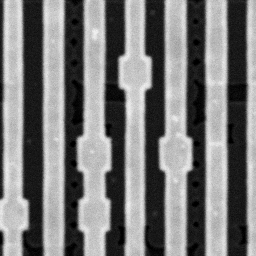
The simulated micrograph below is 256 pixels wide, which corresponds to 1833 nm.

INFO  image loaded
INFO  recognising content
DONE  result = wiring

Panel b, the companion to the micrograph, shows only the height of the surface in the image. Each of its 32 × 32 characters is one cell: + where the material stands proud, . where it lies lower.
.++...++...++...++...++...++...+
.++...++...++...++...++...++...+
.++...++...++...++...++...++...+
.++...++...++...++...++...++...+
.++...++...++...++...++...++...+
.++...++...++...++...++...++...+
.++...++...++...++...++...++...+
.++...++...++..++++..++...++...+
.++...++...++..++++..++...++...+
.++...++...++..++++..++...++...+
.++...++...++..++++..++...++...+
.++...++...++...++...++...++...+
.++...++...++...++...++...++...+
.++...++...++...++...++...++...+
.++...++...++...++...++...++...+
.++...++...++...++...++...++...+
.++...++...++...++...++...++...+
.++...++..+++...++..++++..++...+
.++...++..++++..++..++++..++...+
.++...++..++++..++..++++..++...+
.++...++..++++..++..++++..++...+
.++...++..+++...++...++...++...+
.++...++...++...++...++...++...+
.++...++...++...++...++...++...+
.++...++...++...++...++...++...+
+++...++..++++..++...++...++...+
+++...++..++++..++...++...++...+
+++...++..++++..++...++...++...+
+++...++..+++...++...++...++...+
.+....++...++...++...++...++...+
.++...++...++...++...++...++...+
.++...++...++...++...++...++...+